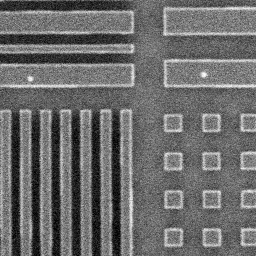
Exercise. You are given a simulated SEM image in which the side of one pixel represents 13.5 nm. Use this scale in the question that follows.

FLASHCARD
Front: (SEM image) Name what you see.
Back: groups of lines, slits or small figures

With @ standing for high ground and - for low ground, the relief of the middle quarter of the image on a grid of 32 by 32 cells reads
@@@@@@@@@@@@@@@@@--------@@@@@@@
@@@@@@@@@@@@@@@@@--------@@@@@@@
@@@@@@@@@@@@@@@@@--------@@@@@@@
@@@@@@@@@@@@@@@@@--------@@@@@@@
@@@@@@@@@@@@@@@@@--------@@@@@@@
--------------------------------
--------------------------------
--------------------------------
--------------------------------
--------------------------------
--------------------------------
--------------------------------
@---@@---@@---@@@---------------
@---@@---@@---@@@--------@@@@---
@---@@---@@@--@@@--------@@@@---
@---@@---@@@--@@@--------@@@@---
@---@@---@@@--@@@--------@@@@---
@---@@---@@@--@@@---------------
@---@@---@@@--@@@---------------
@---@@---@@@--@@@---------------
@---@@---@@@--@@@---------------
@---@@---@@@--@@@---------------
@---@@---@@@--@@@--------@@@@---
@---@@---@@@--@@@--------@@@@---
@---@@---@@@--@@@--------@@@@---
@---@@---@@@--@@@--------@@@@---
@---@@---@@---@@@---------------
@---@@---@@---@@@---------------
@---@@---@@---@@@---------------
@---@@---@@@--@@@---------------
@---@@---@@@--@@@---------------
@---@@---@@@--@@@---------------